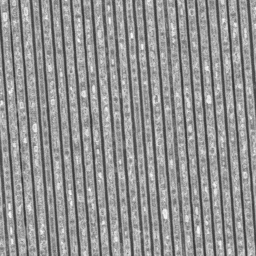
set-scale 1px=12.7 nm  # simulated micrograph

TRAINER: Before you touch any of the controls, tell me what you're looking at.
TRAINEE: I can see parallel lines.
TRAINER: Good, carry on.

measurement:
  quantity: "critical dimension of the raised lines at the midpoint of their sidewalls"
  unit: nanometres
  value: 93.4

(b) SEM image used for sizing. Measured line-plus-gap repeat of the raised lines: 131 nm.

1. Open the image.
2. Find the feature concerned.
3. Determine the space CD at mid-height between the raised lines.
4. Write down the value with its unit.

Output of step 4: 37.9 nanometers